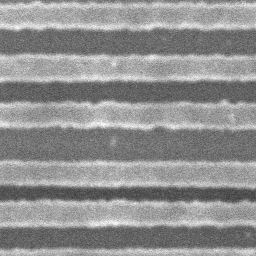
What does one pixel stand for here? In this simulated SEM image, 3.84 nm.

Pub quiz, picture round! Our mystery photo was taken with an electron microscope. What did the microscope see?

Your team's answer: lines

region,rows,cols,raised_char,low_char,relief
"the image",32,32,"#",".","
....#...##.#.......#..##.#....#.
################################
################################
###################..###########
................................
................................
................................
################################
################################
################################
................................
................................
................................
################################
################################
################################
................................
................................
................................
................................
################################
################################
################################
.............................###
................................
################################
################################
################################
................................
................................
................................
################################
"